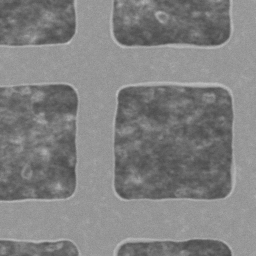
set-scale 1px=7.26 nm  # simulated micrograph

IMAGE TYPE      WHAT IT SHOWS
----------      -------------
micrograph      holes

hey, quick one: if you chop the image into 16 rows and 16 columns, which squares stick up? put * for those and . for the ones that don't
.....**.......**
.....**.......**
....***.......**
****************
****************
.....***......**
.....**........*
.....**........*
.....**........*
.....**........*
.....**........*
.....**.......**
.***************
****************
****************
.....**.......**